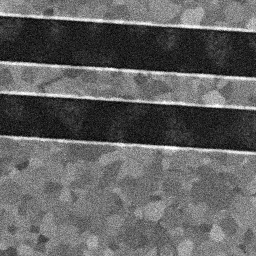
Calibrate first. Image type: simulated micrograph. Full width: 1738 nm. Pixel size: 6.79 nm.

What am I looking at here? one or a few lines or trenches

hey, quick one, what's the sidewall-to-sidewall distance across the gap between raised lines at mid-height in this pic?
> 306 nanometers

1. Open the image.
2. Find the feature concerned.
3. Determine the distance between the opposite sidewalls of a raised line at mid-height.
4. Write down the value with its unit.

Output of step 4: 31.2 pixels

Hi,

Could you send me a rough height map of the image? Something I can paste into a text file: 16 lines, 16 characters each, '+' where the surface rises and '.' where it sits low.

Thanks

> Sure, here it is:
++++++++++++++++
.........+++++++
................
................
++++++++++......
++++++++++++++++
...........+++++
................
................
+++++++++++++++.
++++++++++++++++
++++++++++++++++
++++++++++++++++
++++++++++++++++
++++++++++++++++
++++++++++++++++